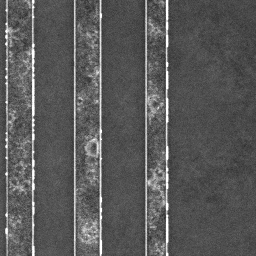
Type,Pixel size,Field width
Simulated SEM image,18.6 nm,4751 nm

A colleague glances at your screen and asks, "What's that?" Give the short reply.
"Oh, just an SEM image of one or a few lines or trenches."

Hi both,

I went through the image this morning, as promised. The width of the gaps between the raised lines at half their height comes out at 0.807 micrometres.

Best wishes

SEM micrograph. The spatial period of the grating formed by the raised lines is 1270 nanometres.